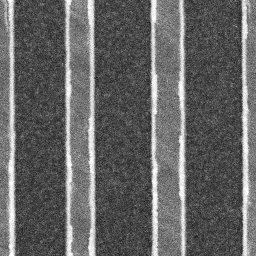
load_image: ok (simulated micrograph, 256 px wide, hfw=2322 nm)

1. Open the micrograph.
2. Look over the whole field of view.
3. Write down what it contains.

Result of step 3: one or a few lines or trenches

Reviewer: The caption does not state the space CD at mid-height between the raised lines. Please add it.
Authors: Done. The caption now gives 552 nm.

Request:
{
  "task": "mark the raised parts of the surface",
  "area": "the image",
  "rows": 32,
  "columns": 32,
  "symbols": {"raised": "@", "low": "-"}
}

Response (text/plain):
@-------@@@--------@@@@--------@
@--------@@--------@@@@--------@
@-------@@@--------@@@@--------@
@-------@@@--------@@@@--------@
@-------@@@--------@@@@--------@
@-------@@@--------@@@@--------@
@--------@@--------@@@@--------@
@@------@@@--------@@@@--------@
@-------@@@--------@@@@--------@
@-------@@@--------@@@@--------@
@-------@@@--------@@@@--------@
@-------@@@--------@@@@-------@@
@-------@@@--------@@@@--------@
@-------@@@--------@@@@--------@
@-------@@@--------@@@@-------@@
@-------@@@@-------@@@@--------@
@@------@@@@-------@@@@--------@
@@------@@@@-------@@@@--------@
@@-------@@@-------@@@@--------@
@@-------@@@-------@@@@--------@
@@-------@@@-------@@@@--------@
@@-------@@@-------@@@@--------@
@@-------@@@-------@@@@--------@
@@-------@@@-------@@@@--------@
@@-------@@@-------@@@@--------@
@@-------@@@-------@@@@--------@
@@-------@@@-------@@@@--------@
@@-------@@@-------@@@@--------@
@@-------@@@-------@@@@--------@
@@-------@@@-------@@@@--------@
@@-------@@@-------@@@@--------@
@@-------@@@-------@@@@--------@